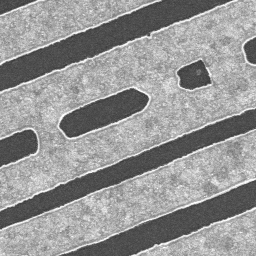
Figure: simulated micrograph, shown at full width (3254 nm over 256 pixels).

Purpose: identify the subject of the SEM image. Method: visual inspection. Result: one or a few lines or trenches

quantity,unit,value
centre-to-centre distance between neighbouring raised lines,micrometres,0.831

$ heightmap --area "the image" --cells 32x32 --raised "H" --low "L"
LLLLHHHHHHHHHHHHHHHLLLLLLLLLHHHH
LHHHHHHHHHHHHHHHLLLLLLLLLLHHHHHH
HHHHHHHHHHHHHHLLLLLLLLLLHHHHHHHH
HHHHHHHHHHHLLLLLLLLLLHHHHHHHHHHH
HHHHHHHHHLLLLLLLLLLHHHHHHHHHHHHH
HHHHHHLLLLLLLLLLHHHHHHHHHHHHHHHL
HHHHLLLLLLLLLHHHHHHHHHHHHHHHHHLL
HLLLLLLLLLLHHHHHHHHHHHHHHHHHHHHL
LLLLLLLLHHHHHHHHHHHHHHHLLLHHHHHH
LLLLLHHHHHHHHHHHHHHHHHLLLLHHHHHH
LLLHHHHHHHHHHHHHHHHHHHLLLLHHHHHH
HHHHHHHHHHHHHHHLLLHHHHHHHHHHHHHH
HHHHHHHHHHHHLLLLLLLHHHHHHHHHHHHH
HHHHHHHHHHLLLLLLLLHHHHHHHHHHHHHH
HHHHHHHHLLLLLLLLHHHHHHHHHHHHHLLL
HHHHHHHLLLLLLLHHHHHHHHHHHHLLLLLL
HHLLHHHHLLLHHHHHHHHHHHHHLLLLLLLH
LLLLLHHHHHHHHHHHHHHHHLLLLLLLLHHH
LLLLLHHHHHHHHHHHHHHLLLLLLLHHHHHH
LLLLHHHHHHHHHHHHLLLLLLLHHHHHHHHH
LHHHHHHHHHHHHHLLLLLLLHHHHHHHHHHH
HHHHHHHHHHHLLLLLLLLHHHHHHHHHHHHH
HHHHHHHHHLLLLLLLHHHHHHHHHHHHHHHH
HHHHHHLLLLLLLHHHHHHHHHHHHHHHHLLL
HHHHLLLLLLLHHHHHHHHHHHHHHHHLLLLL
HHLLLLLLLHHHHHHHHHHHHHHHLLLLLLLL
LLLLLLHHHHHHHHHHHHHHHLLLLLLLLLLH
LLLLHHHHHHHHHHHHHHHLLLLLLLLLHHHH
LHHHHHHHHHHHHHHHLLLLLLLLLHHHHHHH
HHHHHHHHHHHHHHLLLLLLLLLHHHHHHHHH
HHHHHHHHHHHLLLLLLLLLHHHHHHHHHHHH
HHHHHHHHLLLLLLLLLLHHHHHHHHHHHHHH